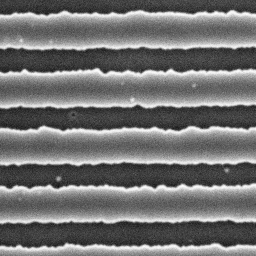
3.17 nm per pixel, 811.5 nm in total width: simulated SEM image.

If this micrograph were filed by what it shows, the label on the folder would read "lines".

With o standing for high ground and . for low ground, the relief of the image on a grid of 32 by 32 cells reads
................................
.................o..............
oooooooooooooooooooooooooooooooo
oooooooooooooooooooooooooooooooo
oooooooooooooooooooooooooooooooo
oooooooooooooooooooooooooooooooo
................................
................................
................................
oooooooooooooooooooooooooooooooo
oooooooooooooooooooooooooooooooo
oooooooooooooooooooooooooooooooo
oooooooooooooooooooooooooooooooo
................................
................................
................................
oooooooooooooooooooooooooooooooo
oooooooooooooooooooooooooooooooo
oooooooooooooooooooooooooooooooo
oooooooooooooooooooooooooooooooo
o.o......o......................
................................
................................
o.o.ooo.ooooooo.ooooo.oooooooooo
oooooooooooooooooooooooooooooooo
oooooooooooooooooooooooooooooooo
oooooooooooooooooooooooooooooooo
oooooooooooooooooooooooo.ooo.ooo
................................
................................
................................
oooooooooooooooooooooooooooooooo